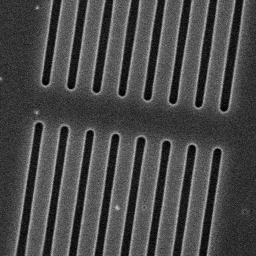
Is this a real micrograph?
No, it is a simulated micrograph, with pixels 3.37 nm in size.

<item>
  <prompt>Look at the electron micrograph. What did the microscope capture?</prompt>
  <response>groups of lines, slits or small figures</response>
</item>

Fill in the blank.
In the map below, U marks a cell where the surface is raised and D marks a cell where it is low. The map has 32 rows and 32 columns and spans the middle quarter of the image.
UDDDUUUUDDUUUUDDDUUUUDDUUUUDDDUU
UDDDUUUUDDUUUUDDUUUUUDDUUUUDDUUU
UDDUUUUDDDUUUUDDUUUUUDDUUUUDDUUU
UDDUUUUDDDUUUUDDUUUUUDDUUUUDDUUU
UDDUUUUDDUUUUUDDUUUUDDDUUUUDDUUU
UDDUUUUDDUUUUUDDUUUUDDDUUUUDDUUU
UUUUUUUDDUUUUUDDUUUUDDUUUUDDDUUU
UUUUUUUUUUUUUUDUUUUUDDUUUUDDDUUU
UUUUUUUUUUUUUUUUUUUUDDUUUUDDUUUU
UUUUUUUUUUUUUUUUUUUUUUUUUUDDUUUU
UUUUUUUUUUUUUUUUUUUUUUUUUUUUUUUU
UUUUUUUUUUUUUUUUUUUUUUUUUUUUUUUU
UUUUUUUUUUUUUUUUUUUUUUUUUUUUUUUU
UUUUUUUUUUUUUUUUUUUUUUUUUUUUUUUU
UUUUUUUUUUUUUUUUUUUUUUUUUUUUUUUU
UUUUUUUUUUUUUUUUUUUUUUUUUUUUUUUU
DUUUUUDUUUUUUUUUUUUUUUUUUUUUUUUU
DUUUUUDDUUUUDUUUUUUUUUUUUUUUUUUU
DUUUUDDUUUUUDDUUUUUDUUUUUUUUUUUU
DUUUUDDUUUUUDDUUUUDDDUUUUDUUUUUU
DUUUUDDUUUUDDDUUUUDDUUUUDDDUUUUD
DUUUUDDUUUUDDDUUUUDDUUUUDDDUUUUD
UUUUUDDUUUUDDUUUUUDDUUUUDDUUUUUD
UUUUUDDUUUUDDUUUUUDDUUUUDDUUUUUD
UUUUUDDUUUUDDUUUUDDDUUUUDDUUUUDD
UUUUDDDUUUUDDUUUUDDDUUUUDDUUUUDD
UUUUDDUUUUDDDUUUUDDUUUUUDDUUUUDD
UUUUDDUUUUDDDUUUUDDUUUUDDDUUUUDD
UUUUDDUUUUDDDUUUUDDUUUUDDUUUUUDD
UUUUDDUUUUDDUUUUUDDUUUUDDUUUUUDD
UUUUDDUUUUDDUUUUUDDUUUUDDUUUUDDD
UUUDDDUUUUDDUUUUDDDUUUUDDUUUUDDD